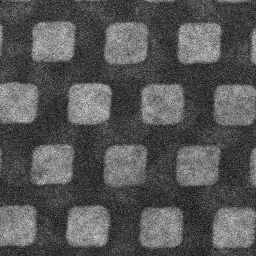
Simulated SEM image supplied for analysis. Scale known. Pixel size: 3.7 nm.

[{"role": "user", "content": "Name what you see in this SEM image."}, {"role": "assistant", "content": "a regular array of raised bodies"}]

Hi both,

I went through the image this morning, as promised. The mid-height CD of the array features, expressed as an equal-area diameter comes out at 151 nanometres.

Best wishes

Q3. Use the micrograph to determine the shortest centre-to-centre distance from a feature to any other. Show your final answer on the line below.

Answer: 261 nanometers